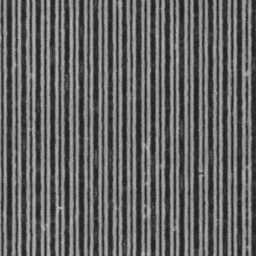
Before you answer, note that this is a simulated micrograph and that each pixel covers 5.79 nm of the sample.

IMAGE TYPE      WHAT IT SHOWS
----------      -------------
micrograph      parallel lines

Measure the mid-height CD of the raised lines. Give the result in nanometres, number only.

17.4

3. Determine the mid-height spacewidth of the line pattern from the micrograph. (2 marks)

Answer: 28.2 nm